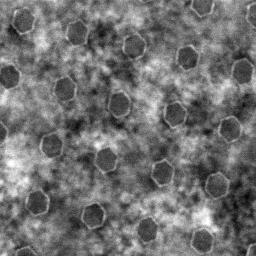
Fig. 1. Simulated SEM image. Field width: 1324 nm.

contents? a regular array of raised bodies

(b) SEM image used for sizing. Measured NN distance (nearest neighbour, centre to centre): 290 nanometres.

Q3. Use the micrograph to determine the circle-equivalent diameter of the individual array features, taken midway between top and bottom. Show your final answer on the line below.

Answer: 124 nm